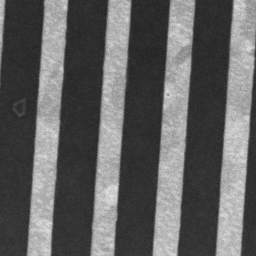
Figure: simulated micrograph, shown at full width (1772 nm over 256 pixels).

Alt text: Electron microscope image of one or a few lines or trenches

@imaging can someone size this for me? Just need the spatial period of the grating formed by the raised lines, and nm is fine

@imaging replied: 434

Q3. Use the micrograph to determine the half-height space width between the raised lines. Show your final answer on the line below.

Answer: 39.9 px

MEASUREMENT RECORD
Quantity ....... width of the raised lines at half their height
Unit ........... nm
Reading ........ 156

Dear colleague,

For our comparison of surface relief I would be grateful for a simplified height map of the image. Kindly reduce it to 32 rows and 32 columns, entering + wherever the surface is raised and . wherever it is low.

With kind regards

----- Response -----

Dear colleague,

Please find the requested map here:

+.....++......++.....+++.....+++
+.....++.....+++.....+++.....+++
.....+++.....+++.....+++.....+++
.....+++.....+++.....+++.....+++
.....+++.....+++.....+++.....+++
.....+++.....+++.....+++.....+++
.....+++.....+++.....+++.....+++
.....+++.....+++.....+++.....+++
.....+++.....+++.....+++.....+++
.....+++.....+++.....+++.....+++
.....+++.....+++.....+++.....++.
.....+++.....+++.....++.....+++.
.....+++.....++.....+++.....+++.
..+..+++.....++.....+++.....+++.
.....++......++.....+++.....+++.
.....++......++.....+++.....+++.
.....++.....+++.....+++.....+++.
....+++.....+++.....+++.....+++.
....+++.....+++.....+++.....+++.
....+++.....+++.....+++.....+++.
....+++.....+++.....+++.....+++.
....+++.....+++.....+++.....+++.
....+++.....+++.....+++.....+++.
....+++.....+++.....+++.....+++.
....+++.....+++.....+++.....+++.
....+++.....+++.....+++....+++..
....+++.....+++.....++.....+++..
....+++.....+++.....++.....+++..
....++......++.....+++.....+++..
....++......++.....+++.....+++..
....++.....+++.....+++.....+++..
...+++.....+++.....+++.....+++..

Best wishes